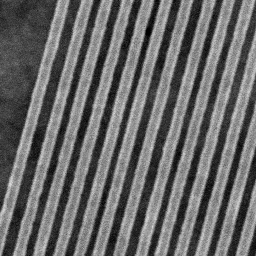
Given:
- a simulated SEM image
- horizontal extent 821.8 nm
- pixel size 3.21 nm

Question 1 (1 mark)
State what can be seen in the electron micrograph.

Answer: parallel lines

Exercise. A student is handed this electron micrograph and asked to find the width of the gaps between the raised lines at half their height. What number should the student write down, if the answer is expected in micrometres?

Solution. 0.0345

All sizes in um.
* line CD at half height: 0.0284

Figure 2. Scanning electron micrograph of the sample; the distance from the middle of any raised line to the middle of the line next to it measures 63.6 nanometres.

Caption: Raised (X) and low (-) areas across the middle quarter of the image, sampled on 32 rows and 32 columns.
XX---XXX--XXX---XX--XX---XX----X
XX---XX---XX---XXX--XX---XX----X
XX---XX---XX---XX---XX---XX----X
XX--XXX---XX---XX--XX---XXX---XX
X---XX---XX---XXX--XX---XX----XX
X---XX---XX---XX---XX---XX---XXX
X---XX---XX---XX--XXX---XX---XX-
X--XXX--XXX---XX--XX---XXX---XX-
---XX---XX---XX---XX---XX----XX-
---XX---XX---XX---XX---XX---XXX-
---XX---XX---XX---XX---XX---XX--
--XX---XXX--XXX--XX----XX---XX--
--XX---XX---XX---XX---XX----XX--
--XX---XX---XX---XX---XX----XX--
--XX---XX---XX--XXX---XX---XX---
-XX---XXX--XXX--XX---XX----XX---
-XX---XX---XX---XX---XX----XX--X
-XX---XX---XX---XX---XX---XX---X
XXX---XX---XX--XX---XXX---XX---X
XX---XX----XX--XX---XX----XX---X
XX---XX---XX---XX---XX---XXX--XX
XX---XX---XX---XX---XX---XX---XX
XX--XXX--XXX--XX---XXX---XX---XX
X---XX---XX---XX---XX----XX---XX
X---XX---XX---XX---XX---XXX--XX-
X---XX---XX--XXX---XX---XX---XX-
---XXX---XX--XX---XXX---XX---XX-
---XX---XX---XX---XX----XX--XXX-
---XX---XX---XX---XX---XXX--XX--
---XX---XX--XXX--XXX---XX---XX--
--XXX--XXX--XX---XX----XX---XX--
--XX---XX---XX---XX----XX--XXX--